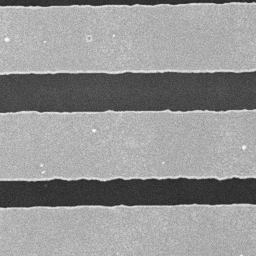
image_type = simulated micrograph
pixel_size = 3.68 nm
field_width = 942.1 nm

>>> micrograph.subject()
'lines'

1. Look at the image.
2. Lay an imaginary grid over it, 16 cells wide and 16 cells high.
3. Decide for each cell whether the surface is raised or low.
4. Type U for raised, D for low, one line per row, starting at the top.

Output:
UUUUUUUUUUUUUUUU
UUUUUUUUUUUUUUUU
UUUUUUUUUUUUUUUU
UUUUUUUUUUUUUUUU
UUUUUUUUUUUUUUUD
DDDDDDDDDDDDDDDD
DDDDDDDDDDDDDDDD
UUUUUUUUUUUUUUUU
UUUUUUUUUUUUUUUU
UUUUUUUUUUUUUUUU
UUUUUUUUUUUUUUUU
DDDDDDDDDDDDDDDD
DDDDDDDDDDDDDDDD
UUUUUUUUUUUUUUUU
UUUUUUUUUUUUUUUU
UUUUUUUUUUUUUUUU